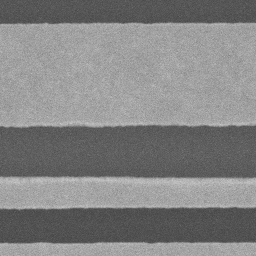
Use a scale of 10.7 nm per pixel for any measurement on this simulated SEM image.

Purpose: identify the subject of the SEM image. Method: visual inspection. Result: lines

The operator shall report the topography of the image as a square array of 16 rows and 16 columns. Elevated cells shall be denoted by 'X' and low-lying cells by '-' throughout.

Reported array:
----------------
-XXXXXXXXXXXXXXX
XXXXXXXXXXXXXXXX
XXXXXXXXXXXXXXXX
XXXXXXXXXXXXXXXX
XXXXXXXXXXXXXXXX
XXXXXXXXXXXXXXXX
XXXXXXXXXXXXXXXX
----------------
----------------
----------------
XXXXXXXXXXXXXXXX
XXXXXXXXXXXXXXXX
----------------
----------------
XXXXXXXXXXXXXXXX